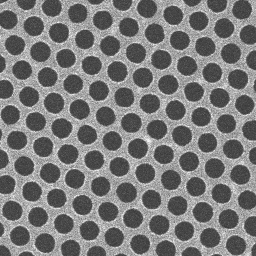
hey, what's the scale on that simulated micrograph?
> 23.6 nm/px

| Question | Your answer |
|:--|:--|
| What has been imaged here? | a regular array of holes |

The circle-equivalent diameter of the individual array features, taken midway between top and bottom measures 479 nm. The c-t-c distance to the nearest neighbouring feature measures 612 nm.